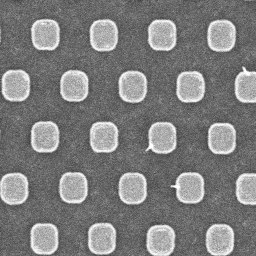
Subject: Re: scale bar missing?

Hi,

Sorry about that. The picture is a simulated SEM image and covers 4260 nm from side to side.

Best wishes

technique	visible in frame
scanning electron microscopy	a regular array of raised bodies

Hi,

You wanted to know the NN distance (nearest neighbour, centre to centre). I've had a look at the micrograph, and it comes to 971 nm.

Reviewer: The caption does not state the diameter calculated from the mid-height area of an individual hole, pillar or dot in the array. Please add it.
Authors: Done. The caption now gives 30 px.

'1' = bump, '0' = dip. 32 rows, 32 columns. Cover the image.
00000000000000000000000000000000
00000000000000000000000000000000
00000000000000000000000000000000
00001110000111100001110000111000
00001110000111100001110000111000
00001110000111000001110000111000
00000000000000000000000000000000
00000000000000000000000000000000
00000000000000000000000000000000
01100000111000011100001110000011
11110000111000011100001110000011
11110000111000011100001110000011
01100000110000001100000110000011
00000000000000000000000000000000
00000000000000000000000000000000
00000110000011000001100000000000
00001110000111100001110000111000
00001110000111100001110000111000
00001110000011000001110000111000
00000000000000000000000000000000
00000000000000000000000000000000
00000000000000000000000000000000
11100000111000011100001110000011
11100000111000011100001110000011
11100000111000011100001110000011
00000000000000000000000000000000
00000000000000000000000000000000
00000000000000000000000000000000
00001110000111000001100000111000
00001110000111000011110000111000
00001110000111000011110000111000
00000110000011000001100000111000